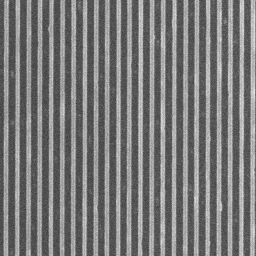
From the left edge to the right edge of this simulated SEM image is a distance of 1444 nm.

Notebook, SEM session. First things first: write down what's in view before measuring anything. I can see parallel lines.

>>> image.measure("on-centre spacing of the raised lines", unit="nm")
63.2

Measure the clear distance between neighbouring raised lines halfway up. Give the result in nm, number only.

40.2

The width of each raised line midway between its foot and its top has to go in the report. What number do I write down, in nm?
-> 20.4